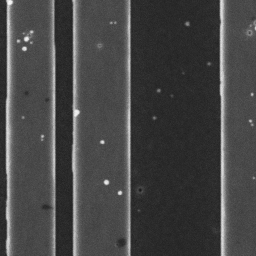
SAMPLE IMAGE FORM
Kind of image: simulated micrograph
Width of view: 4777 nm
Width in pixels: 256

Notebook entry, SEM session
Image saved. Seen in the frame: lines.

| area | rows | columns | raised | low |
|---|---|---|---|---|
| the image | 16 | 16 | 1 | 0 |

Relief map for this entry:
1110011100000011
1110011100000011
1110011100000011
1110011100000011
1110011100000011
1110011100000011
1110011100000011
1110011100000011
1110011100000011
1110011100000011
1110011100000011
1110011100000011
1110011100000011
1110011100000011
1110011100000011
1110011100000011